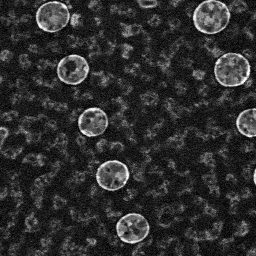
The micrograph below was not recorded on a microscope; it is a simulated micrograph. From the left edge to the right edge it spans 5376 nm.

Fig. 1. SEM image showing raised bodies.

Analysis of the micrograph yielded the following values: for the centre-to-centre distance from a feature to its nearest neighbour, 1.19 micrometres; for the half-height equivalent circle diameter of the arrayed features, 629 nanometres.